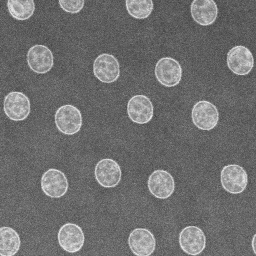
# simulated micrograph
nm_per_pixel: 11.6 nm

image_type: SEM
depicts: a regular array of raised bodies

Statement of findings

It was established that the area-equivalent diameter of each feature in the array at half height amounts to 26.7 px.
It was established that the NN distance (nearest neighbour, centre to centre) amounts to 628 nm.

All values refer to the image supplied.